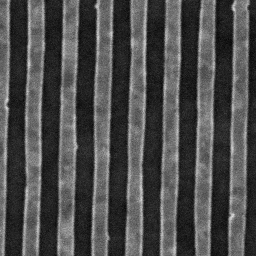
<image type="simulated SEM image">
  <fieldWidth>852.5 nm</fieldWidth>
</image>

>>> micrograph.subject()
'parallel lines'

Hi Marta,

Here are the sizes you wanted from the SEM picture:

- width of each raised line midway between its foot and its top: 49.6 nanometres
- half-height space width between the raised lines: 66.2 nanometres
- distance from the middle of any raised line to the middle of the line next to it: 0.114 micrometres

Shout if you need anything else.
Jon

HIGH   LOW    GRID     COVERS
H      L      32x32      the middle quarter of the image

HHHLLLLLHHHHLLLLLHHHLLLLLHHHHLLL
HHHLLLLLHHHHLLLLLHHHLLLLLHHHHLLL
HHHLLLLLHHHHLLLLLHHHLLLLLHHHHLLL
HHHLLLLLHHHHLLLLLHHHLLLLLHHHHLLL
HHHLLLLLHHHHLLLLLHHHLLLLLHHHHLLL
HHHLLLLLHHHLLLLLLHHHLLLLLHHHHLLL
HHHLLLLLHHHLLLLLLHHHLLLLLHHHLLLL
HHHLLLLLHHHLLLLLLHHHLLLLLHHHLLLL
HHHLLLLLHHHLLLLLLHHHLLLLLHHHLLLL
HHHLLLLLHHHLLLLLLHHHLLLLLHHHLLLL
HHHLLLLLHHHLLLLLLHHHLLLLLHHHLLLL
HHHLLLLLHHHLLLLLLHHHLLLLLHHHLLLL
HHHLLLLLHHHLLLLLLHHHLLLLLHHHLLLL
HHHLLLLLHHHLLLLLHHHHLLLLLHHHLLLL
HHHLLLLLHHHLLLLLHHHHLLLLLHHHLLLL
HHHLLLLLHHHLLLLLHHHHLLLLLHHHLLLL
HHHLLLLLHHHLLLLLHHHHLLLLLHHHLLLL
HHHLLLLLHHHLLLLLHHHHLLLLLHHHLLLL
HHHLLLLLHHHLLLLLHHHHLLLLLHHHLLLL
HHHLLLLLHHHLLLLLHHHHLLLLLHHHLLLL
HHHLLLLLHHHLLLLLHHHHLLLLLHHHLLLL
HHHLLLLLHHHLLLLLHHHHLLLLLHHHLLLL
HHHLLLLLHHHLLLLLHHHHLLLLLHHHLLLL
HHHLLLLLHHHLLLLLHHHLLLLLLHHHLLLL
HHHLLLLLHHHLLLLLHHHLLLLLLHHHLLLL
HHHLLLLLHHHLLLLLHHHLLLLLLHHHLLLL
HHHLLLLLHHHLLLLLHHHLLLLLLHHHLLLL
HHHLLLLLHHHLLLLLHHHLLLLLLHHHLLLL
HHHLLLLLHHHLLLLLHHHLLLLLLHHHLLLL
HHHLLLLLHHHLLLLLHHHLLLLLLHHHLLLL
HHLLLLLLHHHLLLLLHHHLLLLLLHHHLLLL
HHLLLLLLHHHLLLLLHHHLLLLLLHHHLLLL